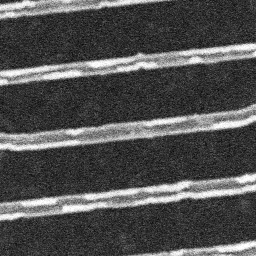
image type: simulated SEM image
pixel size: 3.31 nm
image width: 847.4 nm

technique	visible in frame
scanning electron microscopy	one or a few lines or trenches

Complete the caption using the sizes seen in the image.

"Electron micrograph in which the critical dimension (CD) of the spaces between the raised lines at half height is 0.172 um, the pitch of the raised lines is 0.219 um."